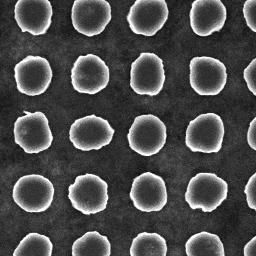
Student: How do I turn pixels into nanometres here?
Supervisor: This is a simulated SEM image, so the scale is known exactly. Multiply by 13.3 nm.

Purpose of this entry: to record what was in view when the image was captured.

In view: a regular array of raised bodies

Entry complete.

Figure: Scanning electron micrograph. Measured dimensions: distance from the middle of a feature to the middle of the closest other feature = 757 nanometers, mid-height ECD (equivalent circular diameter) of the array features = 0.515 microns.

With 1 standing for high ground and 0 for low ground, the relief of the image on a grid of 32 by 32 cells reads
00111100011111000111100011110001
00111100011111001111100011110011
00111100011111001111100011110001
00011100011110001111000011100001
00000000000000000000000000000000
00000000000000000000000000000000
00000000000000000000000000000000
00011100001110000111000011100000
00111100011110001111000011110001
00111100011111001111100011110001
00111100011110001111000011110001
00011000001100000111000001100001
00000000000000000000000000000000
00000000000000000000000000000000
00011100000100000010000001100000
00111100011110000111000011110001
00111100011111001111100111110001
00111100011111001111100111110001
00011100001110000111000011100000
00000000000000000000000000000000
00000000000000000000000000000000
00000000000000000000000000000000
00111100011110000111000011110001
00111110011110000111100111110001
00111110011110001111100111110001
00111100011110000111100011100001
00000000001100000000000000000000
00000000000000000000000000000000
00000000000000000000000000000000
00011000001110000111000011100000
00111100011111000111100111110001
00111100011111001111100111110001